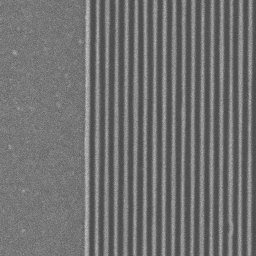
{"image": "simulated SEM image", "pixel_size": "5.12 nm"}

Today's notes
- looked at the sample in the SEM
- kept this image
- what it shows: parallel lines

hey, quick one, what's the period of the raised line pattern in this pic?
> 48.8 nanometres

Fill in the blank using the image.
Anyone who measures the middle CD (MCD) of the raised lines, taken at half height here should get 19.8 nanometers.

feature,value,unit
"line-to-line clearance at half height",30.1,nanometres